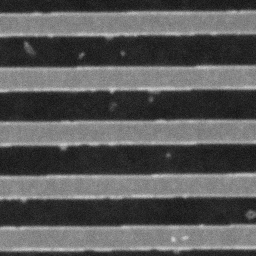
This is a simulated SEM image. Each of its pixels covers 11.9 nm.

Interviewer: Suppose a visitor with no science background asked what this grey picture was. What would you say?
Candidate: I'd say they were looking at lines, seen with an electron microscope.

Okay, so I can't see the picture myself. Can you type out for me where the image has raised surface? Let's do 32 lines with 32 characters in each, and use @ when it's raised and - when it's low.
--------------------------------
----------------------------@@@@
@@@@@@@@@@@@@@@@@@@@@@@@@@@@@@@@
@@@@@@@@@@@@@@@@@@@@@@@@@@@@@@@@
@-------------------------------
--------------------------------
--------------------------------
--------------------------------
---------@@@@@@@@@@@@@@@@@@@@@@@
@@@@@@@@@@@@@@@@@@@@@@@@@@@@@@@@
@@@@@@@@@@@@@@@@@@@@@@@@@@@@@@@@
--------------------------------
--------------------------------
--------------------------------
--------------------------------
@@@@@@@@@@@@@@@@@@@@@@@@@@@@@@@@
@@@@@@@@@@@@@@@@@@@@@@@@@@@@@@@@
@@@@@@@@@@@@@@@@@@@@@@@@@@@@@@@@
--------------------------------
--------------------------------
--------------------------------
--------------------------------
@@@@@@@@@@@@@@@@@@@@@@@@@@@@@@@@
@@@@@@@@@@@@@@@@@@@@@@@@@@@@@@@@
@@@@@@@@@@@@@@@@@@@@@@@@@@@@@@@@
--------------------------------
--------------------------------
--------------------------------
@@@@@@@@@@@@@@@@@@@@@@@@@@@@@@@@
@@@@@@@@@@@@@@@@@@@@@@@@@@@@@@@@
@@@@@@@@@@@@@@@@@@@@@@@@@@@@@@@@
--------------------------------